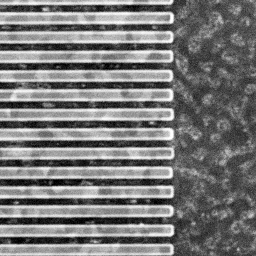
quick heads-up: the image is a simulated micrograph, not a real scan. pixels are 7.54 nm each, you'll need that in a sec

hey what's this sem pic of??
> parallel lines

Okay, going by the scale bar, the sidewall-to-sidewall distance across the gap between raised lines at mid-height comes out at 74.4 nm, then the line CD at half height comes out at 0.0678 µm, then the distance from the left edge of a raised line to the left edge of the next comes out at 146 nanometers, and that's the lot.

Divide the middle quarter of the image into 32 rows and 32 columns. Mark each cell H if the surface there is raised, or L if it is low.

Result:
LLLLLLLLLLLLLLLLLLLLLLLLLLLLLLLL
LLLLLLLLLLLLLLLLLLLLLLLLLLLLLLLL
HHHHHHHHHHHHHHHHHHHHHHHHHHHLLLLL
HHHHHHHHHHHHHHHHHHHHHHHHHHHLLLLL
LLLLLLLLLLLLLLLLLLLLLLLLLLLLLLLL
LLLLLLLLLLLLLLLLLLLLLLLLLLLLLLLL
LLLLLLLLLLLLLLLLLLLLLLLLLLLLLLLL
HHHHHHHHHHHHHHHHHHHHHHHHHHHLLLLL
HHHHHHHHHHHHHHHHHHHHHHHHHHHLLLLL
LLLLLLLLLLLLLLLLLLLLLLLLLLLLLLLL
LLLLLLLLLLLLLLLLLLLLLLLLLLLLLLLL
LLLLLLLLLLLLLLHHHHHHHHHHHHHLLLLL
HHHHHHHHHHHHHHHHHHHHHHHHHHHLLLLL
HHHHHHHHHHHHHHHHHHHHHHHHHHHLLLLL
LLLLLLLLLLLLLLLLLLLLLLLLLLLLLLLL
LLLLLLLLLLLLLLLLLLLLLLLLLLLLLLLL
LLLLLLLLLLLLLLLLLLLLLLLLLLLLLLLL
HHHHHHHHHHHHHHHHHHHHHHHHHHHLLLLL
HHHHHHHHHHHHHHHHHHHHHHHHHHHLLLLL
LLLLLLLLLLLLLLLLLLLLLLLLLLLLLLLL
LLLLLLLLLLLLLLLLLLLLLLLLLLLLLLLL
HHHHHHHHHHHHHHHHHHHHHHHHHHHLLLLL
HHHHHHHHHHHHHHHHHHHHHHHHHHHLLLLL
HLLLLLLLLLLLLLLLLLLLLLLLLLLLLLLL
LLLLLLLLLLLLLLLLLLLLLLLLLLLLLLLL
LLLLLLLLLLLLLLLLLLLLLLLLLLLLLLLL
HHHHHHHHHHHHHHHHHHHHHHHHHHHLLLLL
HHHHHHHHHHHHHHHHHHHHHHHHHHHLLLLL
LLLLLLLLLLLLLLLLLLLLLLLLLLLLLLLL
LLLLLLLLLLLLLLLLLLLLLLLLLLLLLLLL
LLLLLLLLLLLLLLLLLLLLLLLLLLLLLLLL
HHHHHHHHHHHHHHHHHHHHHHHHHHHLLLLL